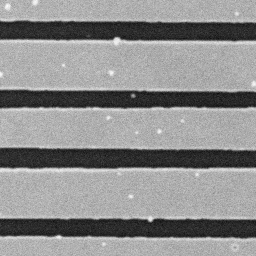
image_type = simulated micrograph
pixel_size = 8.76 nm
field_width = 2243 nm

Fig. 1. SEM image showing lines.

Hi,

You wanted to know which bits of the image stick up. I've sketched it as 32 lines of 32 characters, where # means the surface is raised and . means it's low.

################################
################################
##.#############################
................................
................................
################################
################################
################################
################################
################################
################################
................................
................................
...........##......######......#
################################
################################
################################
################################
................################
................................
................................
################################
################################
################################
################################
################################
################################
................................
................................
................................
################################
################################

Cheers